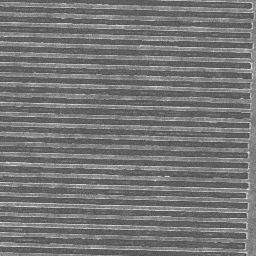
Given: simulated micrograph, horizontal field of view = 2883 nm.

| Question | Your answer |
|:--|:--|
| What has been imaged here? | parallel lines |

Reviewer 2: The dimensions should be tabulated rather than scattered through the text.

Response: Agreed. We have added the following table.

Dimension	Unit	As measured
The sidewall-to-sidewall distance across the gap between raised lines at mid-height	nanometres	74.6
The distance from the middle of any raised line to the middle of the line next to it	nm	113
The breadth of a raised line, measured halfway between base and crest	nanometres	42.2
